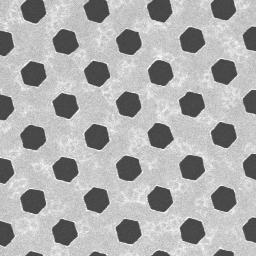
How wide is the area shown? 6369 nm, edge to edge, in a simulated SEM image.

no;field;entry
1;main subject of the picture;a regular array of holes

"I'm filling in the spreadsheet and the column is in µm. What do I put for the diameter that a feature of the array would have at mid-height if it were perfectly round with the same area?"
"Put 0.632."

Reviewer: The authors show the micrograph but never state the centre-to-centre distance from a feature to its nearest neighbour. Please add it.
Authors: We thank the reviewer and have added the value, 44.3 px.